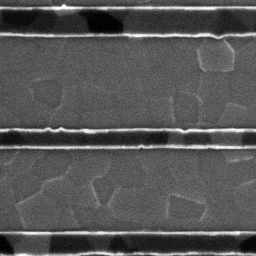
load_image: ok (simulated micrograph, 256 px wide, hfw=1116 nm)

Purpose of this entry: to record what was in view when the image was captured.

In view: one or a few lines or trenches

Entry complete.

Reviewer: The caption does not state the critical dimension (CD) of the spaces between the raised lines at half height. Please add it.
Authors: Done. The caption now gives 0.369 µm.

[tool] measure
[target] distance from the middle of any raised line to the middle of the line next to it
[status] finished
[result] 494 nm